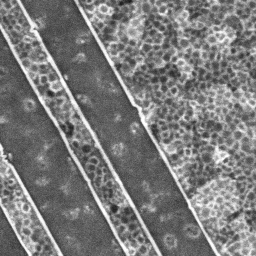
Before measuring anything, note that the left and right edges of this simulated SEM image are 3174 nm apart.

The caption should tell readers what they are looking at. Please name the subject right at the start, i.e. one or a few lines or trenches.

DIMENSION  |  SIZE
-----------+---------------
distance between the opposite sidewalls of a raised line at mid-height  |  352 nm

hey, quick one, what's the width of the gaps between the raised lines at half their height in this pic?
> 50.5 pixels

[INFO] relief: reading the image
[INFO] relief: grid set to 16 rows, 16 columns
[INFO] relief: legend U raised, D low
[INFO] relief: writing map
UDDDDUUUUUUUUUUU
UUDDDDUUUUUUUUUU
UUDDDDUUUUUUUUUU
DUUDDDDUUUUUUUUU
DDUUDDDUUUUUUUUU
DDUUDDDDUUUUUUUU
DDDUUDDDUUUUUUUU
DDDUUDDDDUUUUUUU
DDDDUUDDDUUUUUUU
DDDDUUDDDDUUUUUU
UDDDDUUDDDDUUUUU
UDDDDDUUDDDUUUUU
UUDDDDUUDDDDUUUU
UUUDDDDUUDDDUUUU
DUUDDDDUUDDDDUUU
DDUUDDDDUUDDDUUU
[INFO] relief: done